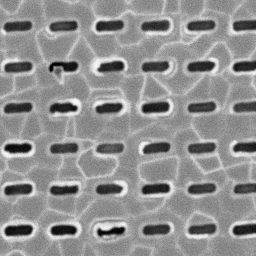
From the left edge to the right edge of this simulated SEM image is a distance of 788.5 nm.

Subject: a regular array of holes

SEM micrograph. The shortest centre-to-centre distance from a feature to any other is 126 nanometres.